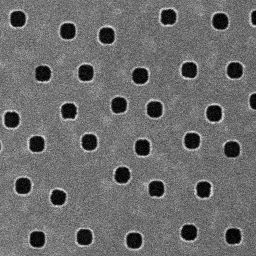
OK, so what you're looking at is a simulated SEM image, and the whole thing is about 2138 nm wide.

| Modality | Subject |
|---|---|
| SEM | a regular array of holes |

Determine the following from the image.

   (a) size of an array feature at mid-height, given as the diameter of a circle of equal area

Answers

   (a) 143 nm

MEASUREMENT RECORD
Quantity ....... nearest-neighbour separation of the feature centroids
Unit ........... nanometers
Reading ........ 328